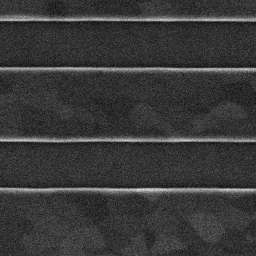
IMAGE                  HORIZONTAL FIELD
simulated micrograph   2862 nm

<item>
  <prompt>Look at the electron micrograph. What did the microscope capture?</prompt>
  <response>wiring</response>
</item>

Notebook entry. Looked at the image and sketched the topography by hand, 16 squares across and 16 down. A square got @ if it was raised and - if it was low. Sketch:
@@@@@@@@@@@@@@@@
----------------
----------------
----------------
@@@@@@@@@@@@@@@@
@@@@@@@@@@@@@@@@
@@@@@@@@@@@@@@@@
@@@@@@@@@@@@@@@@
@@@@@@@@@@@@@@@@
----------------
----------------
----------------
@@@@@@@@@@@@@@@@
@@@@@@@@@@@@@@@@
@@@@@@@@@@@@@@@@
@@@@@@@@@@@@@@@@